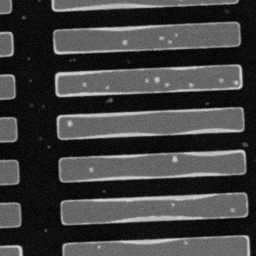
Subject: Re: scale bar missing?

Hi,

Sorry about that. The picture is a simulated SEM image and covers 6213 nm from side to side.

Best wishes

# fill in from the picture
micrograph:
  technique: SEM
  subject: groups of lines, slits or small figures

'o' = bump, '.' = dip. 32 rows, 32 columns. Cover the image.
o......oooooooooooooooooooo.....
o...............................
................................
.................ooooooooooooo..
o......ooooooooooooooooooooooo..
oo.....ooooooooooooooooooooooo..
oo.....oooo.....................
................................
........................oooooo..
o......ooooooooooooooooooooooo..
oo.....ooooooooooooooooooooooo..
oo.....oooooooooooooo...........
................................
................................
.............ooooooooooooooooo..
oo.....ooooooooooooooooooooooo..
oo.....oooooooooooooooooo.......
oo..............................
................................
................ooooooooooooooo.
oo.....oooooooooooooooooooooooo.
oo.....oooooooooooooooooooooooo.
oo......ooo.....................
................................
.........................oooooo.
oo......ooooooooooooooooooooooo.
ooo.....ooooooooooooooooooooooo.
ooo.....oooooooo................
................................
................................
........ooooooooooooooooooooooo.
ooo.....ooooooooooooooooooooooo.